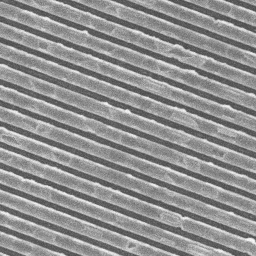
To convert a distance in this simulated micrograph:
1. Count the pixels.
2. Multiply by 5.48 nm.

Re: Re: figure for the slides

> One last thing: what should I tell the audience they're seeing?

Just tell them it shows parallel lines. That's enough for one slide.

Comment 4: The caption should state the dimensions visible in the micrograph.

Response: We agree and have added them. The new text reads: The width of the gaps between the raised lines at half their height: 33.4 nanometers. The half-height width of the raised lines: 71.9 nm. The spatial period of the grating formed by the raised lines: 108 nm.